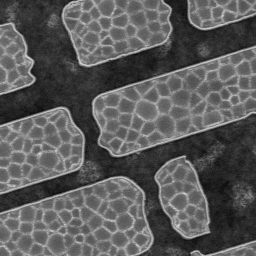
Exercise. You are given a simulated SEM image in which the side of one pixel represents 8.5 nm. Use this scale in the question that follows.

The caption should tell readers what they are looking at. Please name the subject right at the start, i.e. one or a few lines or trenches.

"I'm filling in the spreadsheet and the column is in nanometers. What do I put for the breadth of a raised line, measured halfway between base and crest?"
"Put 541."